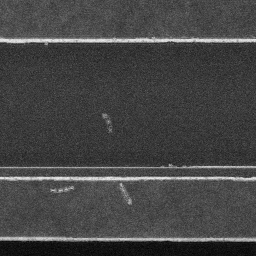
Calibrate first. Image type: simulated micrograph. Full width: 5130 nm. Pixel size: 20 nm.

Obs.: lines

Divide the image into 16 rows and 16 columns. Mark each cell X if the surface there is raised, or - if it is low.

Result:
XXXXXXXXXXXXXXXX
XXXXXXXXXXXXXXXX
XXXXXXXXXXXXXXXX
----------------
----------------
----------------
----------------
----------------
----------------
----------------
XXXXXXXXXXXXXXXX
XXXXXXXXXXXXXXXX
XXXXXXXXXXXXXXXX
XXXXXXXXXXXXXXXX
XXXXXXXXXXXXXXXX
----------------